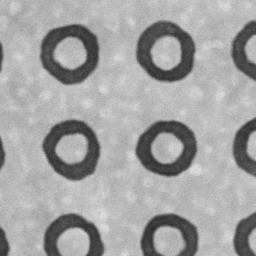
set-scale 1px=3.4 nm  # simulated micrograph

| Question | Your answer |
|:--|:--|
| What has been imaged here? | ring-shaped grooves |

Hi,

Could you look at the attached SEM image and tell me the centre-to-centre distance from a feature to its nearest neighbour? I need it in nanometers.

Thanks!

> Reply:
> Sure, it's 324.